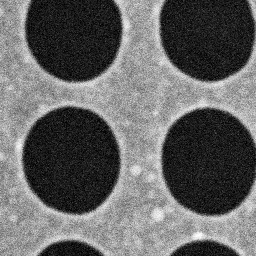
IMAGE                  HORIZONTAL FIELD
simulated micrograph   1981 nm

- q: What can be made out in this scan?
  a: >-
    holes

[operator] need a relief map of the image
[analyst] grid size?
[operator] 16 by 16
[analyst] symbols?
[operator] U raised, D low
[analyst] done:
UUDDDDDUUUDDDDDD
UUDDDDDDUUDDDDDD
UUDDDDDDUUDDDDDD
UUDDDDDUUUDDDDDD
UUUDDDDUUUUDDDDU
UUUUUUUUUUUUUUUU
UUUUUUUUUUUUUUUU
UUDDDDDUUUUDDDDU
UUDDDDDUUUDDDDDD
UDDDDDDDUUDDDDDD
UDDDDDDDUUDDDDDD
UUDDDDDUUUDDDDDD
UUDDDDDUUUUDDDDU
UUUUUUUUUUUUUDUU
UUUUUUUUUUUUUUUU
UUUDDDUUUUUDDDUU